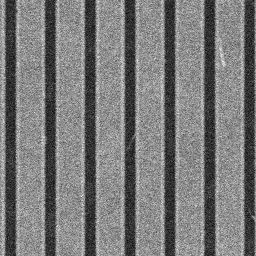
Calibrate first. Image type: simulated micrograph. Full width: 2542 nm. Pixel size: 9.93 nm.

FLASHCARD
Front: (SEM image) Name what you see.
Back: parallel lines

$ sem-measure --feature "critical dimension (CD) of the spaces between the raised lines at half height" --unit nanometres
140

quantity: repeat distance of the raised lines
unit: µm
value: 0.395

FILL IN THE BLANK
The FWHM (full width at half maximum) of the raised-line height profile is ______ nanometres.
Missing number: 262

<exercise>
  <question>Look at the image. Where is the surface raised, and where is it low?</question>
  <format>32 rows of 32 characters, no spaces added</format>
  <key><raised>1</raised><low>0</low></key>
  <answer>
00111001110011100111001110011100
00111001110011100111001110011100
00111001110011100111001110011100
00111001110011100111001110011100
00111001110011100111001110011100
00111001110011100111001110011100
00111001110011100111001110011100
00111001110011100111001110011100
00111001110011100111001110011100
00111001110011100111001110011100
00111001110011100111001110011100
00111001110011100111001110011100
00111001110011100111001110011100
00111001110011100111001110011100
00111001110011100111001110011100
00111001110011100111001110011100
00111001110011100111001110011100
00111001110011100111001110011100
00111001110011100111001110011100
00111001110011100111001110011100
00111001110011100111001110011100
00111001110011100111001110011100
00111001110011100111001110011100
00111001110011100111001110011100
00111001110011100111001110011100
00111001110011100111001110011100
00111001110011100111001110011100
00111001110011100111001110011100
00111001110011100111001110011100
00111001110011100111001110011100
00111001110011100111001110011100
00111001110011100111001110011100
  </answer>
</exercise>